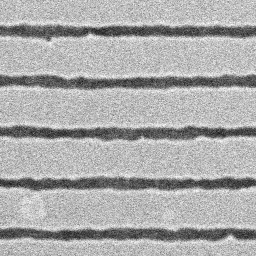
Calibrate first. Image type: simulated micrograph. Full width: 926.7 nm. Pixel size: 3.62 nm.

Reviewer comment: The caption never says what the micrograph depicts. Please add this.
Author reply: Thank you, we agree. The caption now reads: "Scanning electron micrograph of parallel lines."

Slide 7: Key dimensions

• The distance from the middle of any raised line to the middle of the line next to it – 184 nanometres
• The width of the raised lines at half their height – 142 nm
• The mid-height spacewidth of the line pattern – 41.1 nm